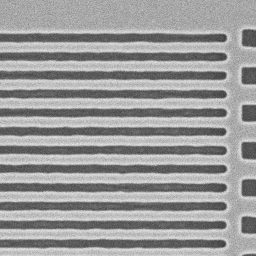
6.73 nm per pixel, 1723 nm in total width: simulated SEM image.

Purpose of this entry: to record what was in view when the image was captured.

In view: groups of lines, slits or small figures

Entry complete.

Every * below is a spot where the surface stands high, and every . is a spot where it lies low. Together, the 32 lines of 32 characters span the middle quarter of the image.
********************************
********************************
................................
................................
********************************
********************************
...........***..............****
................................
................................
********************************
********************************
................................
................................
**.*********************..*****.
********************************
********************************
................................
................................
********************************
********************************
................................
................................
................................
********************************
********************************
................................
................................
*.***..*******..********...*****
********************************
********************************
................................
................................